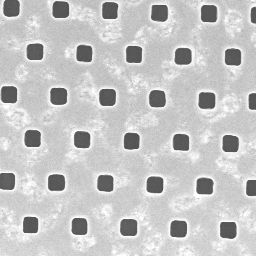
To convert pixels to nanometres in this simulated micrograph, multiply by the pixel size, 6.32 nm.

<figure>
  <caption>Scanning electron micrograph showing a regular array of holes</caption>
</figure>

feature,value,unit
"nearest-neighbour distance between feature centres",0.31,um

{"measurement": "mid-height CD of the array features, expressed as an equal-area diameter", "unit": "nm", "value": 115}